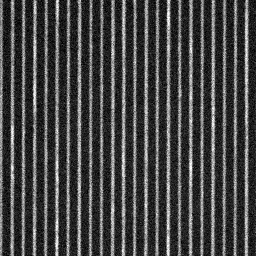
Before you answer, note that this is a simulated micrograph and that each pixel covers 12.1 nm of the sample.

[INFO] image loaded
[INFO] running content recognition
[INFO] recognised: parallel lines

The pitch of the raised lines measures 136 nm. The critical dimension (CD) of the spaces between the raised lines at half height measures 108 nanometers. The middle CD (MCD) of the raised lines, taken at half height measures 25.8 nm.